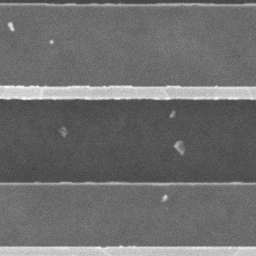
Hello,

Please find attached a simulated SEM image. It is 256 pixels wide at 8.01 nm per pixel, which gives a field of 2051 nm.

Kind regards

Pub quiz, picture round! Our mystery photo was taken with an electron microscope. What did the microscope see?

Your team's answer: lines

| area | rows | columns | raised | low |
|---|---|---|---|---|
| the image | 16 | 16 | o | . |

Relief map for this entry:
oooooooooooooooo
oooooooooooooooo
oooooooooooooooo
oooooooooooooooo
oooooooooooooooo
oooooooooooooooo
................
................
................
................
................
oooooooooooooooo
oooooooooooooooo
oooooooooooooooo
oooooooooooooooo
oooooooooooooooo